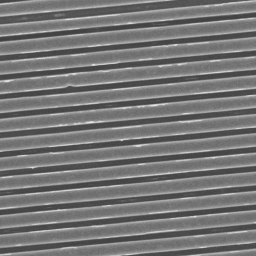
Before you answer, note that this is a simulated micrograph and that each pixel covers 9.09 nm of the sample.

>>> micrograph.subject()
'parallel lines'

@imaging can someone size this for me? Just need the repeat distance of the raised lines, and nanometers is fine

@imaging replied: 174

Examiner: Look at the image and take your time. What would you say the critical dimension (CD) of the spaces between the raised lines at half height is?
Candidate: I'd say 49.8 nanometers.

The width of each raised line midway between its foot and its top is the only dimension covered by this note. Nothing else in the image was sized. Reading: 0.123 micrometres